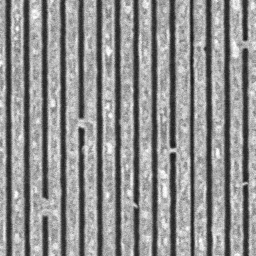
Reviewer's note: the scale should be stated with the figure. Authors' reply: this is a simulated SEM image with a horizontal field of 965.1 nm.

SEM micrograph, parallel lines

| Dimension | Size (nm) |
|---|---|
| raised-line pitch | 68.8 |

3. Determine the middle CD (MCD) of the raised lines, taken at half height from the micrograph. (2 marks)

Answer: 47.2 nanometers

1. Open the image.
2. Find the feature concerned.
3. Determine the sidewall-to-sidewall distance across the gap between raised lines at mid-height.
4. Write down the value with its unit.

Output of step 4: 21.7 nm